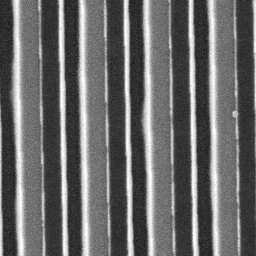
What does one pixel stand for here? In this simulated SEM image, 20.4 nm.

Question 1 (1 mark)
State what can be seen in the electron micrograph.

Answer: lines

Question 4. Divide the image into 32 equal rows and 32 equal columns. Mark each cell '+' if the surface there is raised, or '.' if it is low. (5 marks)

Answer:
..++++++..++++++..++++++...+++++
..++++++..++++++..++++++...+++++
..++++++..++++++..++++++...+++++
..++++++..++++++..++++++...+++++
..++++++..++++++..++++++...+++++
..++++++..++++++..++++++...+++++
..++++++..++++++...+++++...+++++
..++++++..++++++...+++++...+++++
..++++++..++++++...+++++...+++++
..++++++..++++++...+++++...+++++
..++++++..++++++...+++++...+++++
..++++++..++++++...+++++...+++++
..++++++...+++++...+++++...+++++
..++++++...+++++...+++++...+++++
..++++++...+++++...+++++...+++++
..++++++...+++++...+++++...+++++
..++++++...+++++...+++++...+++++
..++++++...+++++...+++++...+++++
..++++++...+++++...+++++...+++++
..++++++...+++++...+++++...+++++
...+++++...+++++...+++++...+++++
...+++++...+++++...+++++...+++++
...+++++...+++++...+++++...+++++
...+++++...+++++...+++++...+++++
...+++++...+++++...+++++...+++++
...+++++...+++++...+++++...+++++
...+++++...+++++...+++++...+++++
...+++++...+++++...+++++...+++++
...+++++...+++++...+++++...+++++
...+++++...+++++...+++++...+++++
...+++++...+++++...+++++...+++++
...+++++...+++++...+++++...+++++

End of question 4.